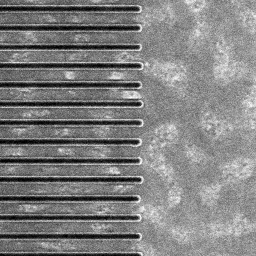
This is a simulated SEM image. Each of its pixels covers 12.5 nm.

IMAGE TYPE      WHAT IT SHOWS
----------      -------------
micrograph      parallel lines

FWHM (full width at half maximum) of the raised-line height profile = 92.3 nm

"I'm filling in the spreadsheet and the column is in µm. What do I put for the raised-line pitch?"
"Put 0.237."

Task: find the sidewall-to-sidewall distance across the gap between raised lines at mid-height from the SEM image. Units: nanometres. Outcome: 149